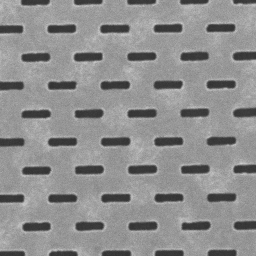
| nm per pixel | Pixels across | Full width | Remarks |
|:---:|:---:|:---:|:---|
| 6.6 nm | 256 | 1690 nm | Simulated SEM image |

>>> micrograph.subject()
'a regular array of holes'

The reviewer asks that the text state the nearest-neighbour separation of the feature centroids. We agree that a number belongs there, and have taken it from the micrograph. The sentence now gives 253 nanometres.